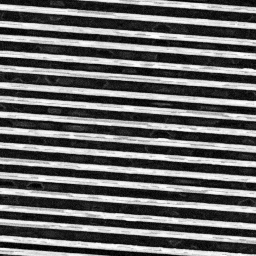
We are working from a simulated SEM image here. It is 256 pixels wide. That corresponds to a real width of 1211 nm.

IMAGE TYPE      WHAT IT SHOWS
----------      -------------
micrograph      parallel lines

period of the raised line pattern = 72.6 nanometres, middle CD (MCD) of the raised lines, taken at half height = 27.1 nanometers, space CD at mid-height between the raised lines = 45.4 nm